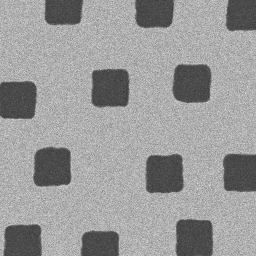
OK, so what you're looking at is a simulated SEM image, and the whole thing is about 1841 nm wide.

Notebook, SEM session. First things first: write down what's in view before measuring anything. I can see holes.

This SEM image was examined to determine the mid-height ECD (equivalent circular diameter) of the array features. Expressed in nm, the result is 295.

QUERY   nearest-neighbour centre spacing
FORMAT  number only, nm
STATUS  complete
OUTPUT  634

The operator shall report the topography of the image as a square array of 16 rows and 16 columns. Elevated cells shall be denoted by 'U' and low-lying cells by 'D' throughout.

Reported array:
UUUDDUUUUDDUUUDD
UUUDDUUUUDDUUUDD
UUUUUUUUUUUUUUUU
UUUUUUUUUUUUUUUU
UUUUUUDDUUUDDUUU
DDUUUUDDUUUDDUUU
DDUUUUDDUUUUUUUU
UUUUUUUUUUUUUUUU
UUUUUUUUUUUUUUUU
UUDDUUUUUUUUUUUU
UUDDUUUUUDDUUUDD
UUDDUUUUUDDUUUDD
UUUUUUUUUUUUUUUU
UUUUUUUUUUUUUUUU
DDDUUUDUUUUDDUUU
DDDUUDDUUUUDDUUU